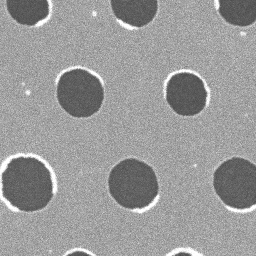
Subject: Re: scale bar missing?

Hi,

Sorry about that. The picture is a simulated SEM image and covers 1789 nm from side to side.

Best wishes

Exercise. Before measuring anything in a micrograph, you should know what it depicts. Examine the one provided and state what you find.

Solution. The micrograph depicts holes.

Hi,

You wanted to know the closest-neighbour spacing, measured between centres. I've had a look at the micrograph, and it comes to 733 nm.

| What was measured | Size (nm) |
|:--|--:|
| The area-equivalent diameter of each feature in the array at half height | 345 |